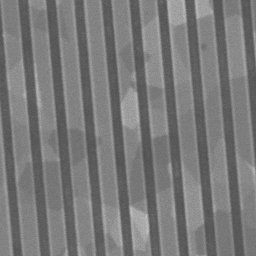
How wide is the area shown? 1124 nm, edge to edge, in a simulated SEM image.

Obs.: parallel lines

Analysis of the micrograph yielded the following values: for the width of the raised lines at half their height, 73.7 nm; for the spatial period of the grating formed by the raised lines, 0.121 um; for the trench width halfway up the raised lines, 45.3 nanometers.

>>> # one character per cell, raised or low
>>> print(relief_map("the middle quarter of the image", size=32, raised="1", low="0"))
11110001111000111100111110011110
11110001111000111100111110011110
11110001111000111100111110001111
11110001111000111100011110001111
11110001111000111100011110001111
11110001111000111100011110001111
11110001111000111100011110001111
11110001111000111100011110001111
11110001111000111100011110001111
11110001111000111100011110001111
01111000111000111100011110001111
01111000111000111110011111001111
01111000111100011110011110001111
01111000111100011110011110001111
01111000111100011110001111000111
01111000111100011110001111000111
01111000111100011110001111000111
01111000111100011110001111000111
01111000111100011110001111000111
01111000111100011110001111000111
01111000111100011110001111000111
00111100111100011110001111000111
00111100111100011110001111000111
00111100011110001111001111000111
00111100011110001111001111000111
00111100011110001111000111100011
00111100011110001111000111100011
00111100011110001111000111100011
00111100011110001111000111100011
00111100011110001111000111100011
00111100011110001111000111100011
00111100011110001111000111100011